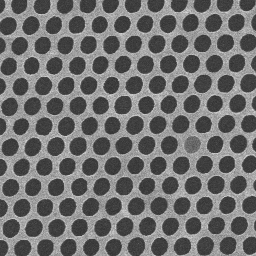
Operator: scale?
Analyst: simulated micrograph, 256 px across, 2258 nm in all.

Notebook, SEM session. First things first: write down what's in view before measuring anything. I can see a regular array of holes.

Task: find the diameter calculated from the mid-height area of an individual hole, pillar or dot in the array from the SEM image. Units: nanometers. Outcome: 154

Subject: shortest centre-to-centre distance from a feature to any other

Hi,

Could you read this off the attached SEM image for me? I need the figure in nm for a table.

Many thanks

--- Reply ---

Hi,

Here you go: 200